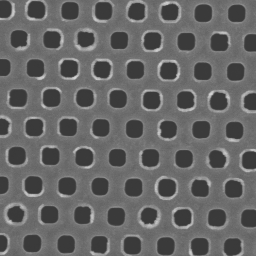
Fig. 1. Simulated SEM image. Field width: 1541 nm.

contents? a regular array of holes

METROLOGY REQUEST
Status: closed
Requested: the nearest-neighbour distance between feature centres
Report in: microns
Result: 0.199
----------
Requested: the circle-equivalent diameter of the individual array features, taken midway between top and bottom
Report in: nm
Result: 110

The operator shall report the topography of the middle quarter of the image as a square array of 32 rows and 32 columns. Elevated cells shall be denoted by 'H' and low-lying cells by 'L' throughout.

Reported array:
LLLHHHHHLLLLHHHHLLLLHHHHLLLLHHHH
LLLHHHHLLLLLHHHHLLLLHHHHLLLLHHHH
LLLHHHHHLLLHHHHHLLLLHHHHLLLLHHHH
HLHHHHHHHHHHHHHHLLLHHHHHHLLLHHHH
HHHHHHHHHHHHHHHHHHHHHHHHHHHHHHHH
HHHHHHHHHHHHHHHHHHHHHHHHHHHHHHHH
HHHHLLLHHHHHHHHHHHHHHHHHHHHHHHHH
HHHLLLLHHHHLLLLHHHHHLLLLHHHHHLLL
HHHLLLLHHHHLLLLLHHHHLLLLHHHHLLLL
HHHLLLLHHHHLLLLLHHHHLLLLHHHHLLLL
HHHHLLLHHHHHLLLHHHHHLLLLHHHHLLLL
HHHHHHHHHHHHHHHHHHHHHHHHHHHHHHHH
HHHHHHHHHHHHHHHHHHHHHHHHHHHHHHHH
HHHHHHHHHHHHHHHHHHHHHHHHHHHHHHHH
LLLHHHHHLLLHHHHHLLLHHHHHHLLHHHHH
LLLHHHHLLLLLHHHLLLLLHHHHLLLLHHHH
LLLHHHHLLLLLHHHLLLLLHHHHLLLLHHHH
LLLHHHHLLLLHHHHHLLLLHHHHLLLLHHHH
HHHHHHHHHHHHHHHHHHHHHHHHHLLHHHHH
HHHHHHHHHHHHHHHHHHHHHHHHHHHHHHHH
HHHHHHHHHHHHHHHHHHHHHHHHHHHHHHHH
HHHHLLHHHHHHLLLHHHHHHLLHHHHHHLLH
HHHLLLLHHHHLLLLHHHHHLLLLHHHHLLLL
HHHLLLLHHHHLLLLLHHHLLLLLHHHHLLLL
HHHLLLLHHHHLLLLHHHHHLLLLHHHHLLLL
HHHHLLHHHHHHLLHHHHHHLLLHHHHHLLLL
HHHHHHHHHHHHHHHHHHHHHHHHHHHHHHHH
HHHHHHHHHHHHHHHHHHHHHHHHHHHHHHHH
LLHHHHHHLLHHHHHHHHHHHHHHHHHHHHHH
LLLHHHHLLLLHHHHHLLLHHHHHLLLLHHHH
LLLHHHHLLLLHHHHLLLLLHHHLLLLLHHHH
LLLHHHHLLLLHHHHLLLLLHHHLLLLLHHHH